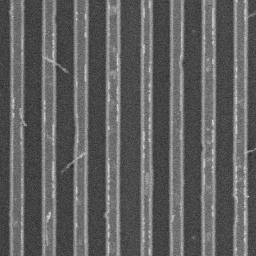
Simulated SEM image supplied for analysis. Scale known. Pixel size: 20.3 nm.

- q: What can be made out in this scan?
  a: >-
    parallel lines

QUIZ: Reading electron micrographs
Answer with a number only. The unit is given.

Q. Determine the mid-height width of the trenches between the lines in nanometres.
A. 404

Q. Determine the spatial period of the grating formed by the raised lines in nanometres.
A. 648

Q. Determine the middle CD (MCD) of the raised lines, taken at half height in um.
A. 0.231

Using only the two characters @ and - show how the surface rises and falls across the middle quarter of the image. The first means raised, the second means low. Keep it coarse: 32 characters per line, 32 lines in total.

---@@@-----@@@------@@-----@@---
---@@@-----@@@------@@-----@@@--
---@@@-----@@@------@@-----@@@--
---@@@-----@@@------@@-----@@@--
---@@@-----@@@------@@-----@@@--
---@@@-----@@@-----@@@-----@@@--
---@@@-----@@@-----@@@-----@@@--
---@@@-----@@@-----@@@-----@@@--
---@@@-----@@@------@@-----@@@--
---@@@-----@@@-----@@@-----@@@--
---@@@-----@@@-----@@@-----@@@--
---@@@-----@@@-----@@@-----@@@--
---@@@-----@@@------@@-----@@@--
---@@@-----@@@------@@-----@@@--
---@@@-----@@@------@@-----@@@--
---@@@-----@@@------@@-----@@@--
---@@@-----@@@------@@-----@@@--
---@@@-----@@@------@@-----@@@--
---@@@-----@@@------@@-----@@@--
---@@@-----@@@------@@-----@@@--
---@@@-----@@@------@@-----@@@--
---@@@-----@@@------@@-----@@@--
---@@@-----@@@------@@-----@@@--
---@@@-----@@@------@@-----@@---
--@@@@-----@@@------@@-----@@---
---@@@-----@@@------@@-----@@---
---@@@-----@@@------@@-----@@@--
---@@@-----@@@------@@-----@@@--
---@@@-----@@@------@@-----@@@--
---@@@-----@@@------@@-----@@@--
---@@@-----@@@------@@-----@@@--
---@@@-----@@@------@@-----@@@--